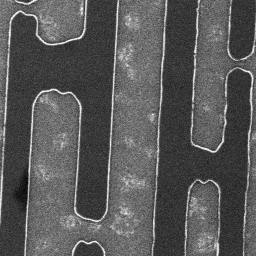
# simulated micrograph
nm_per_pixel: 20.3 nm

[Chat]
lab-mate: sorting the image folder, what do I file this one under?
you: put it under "one or a few lines or trenches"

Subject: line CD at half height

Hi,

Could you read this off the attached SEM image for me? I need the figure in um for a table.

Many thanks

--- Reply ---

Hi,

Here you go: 0.65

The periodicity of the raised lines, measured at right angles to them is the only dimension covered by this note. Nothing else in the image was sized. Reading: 1470 nanometers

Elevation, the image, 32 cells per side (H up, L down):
LLLLLLLLLLLHHHHLLLLLLHHHHLLLLHHH
LLLLLLLLLLLHHHHLLLLLLHHHHLLLLHHH
LHHHHLLLLLLHHHHLLLLLLHHHHLLLLHHH
LHHHHLLLLLLHHHHLLLLLLHHHHLLLLHHH
LHHHHLLLLLHHHHHLLLLLLHHHHLLLLHHH
LHHHHHLHHHHHHHLLLLLLLHHHLLLLLHHH
LHHHHHHHHHHHHHLLLLLLHHHHLLLLLHHL
LHHHHHHHHHHHHHLLLLLLHHHHLLLLLHLL
LHHHHHHHHHHHHHLLLLLLHHHHLLLLLLLL
LHHHHHHHHHHHHHLLLLLLHHHHLLLLHHHL
LHHHHHHHHHHHHHLLLLLLHHHHLLLLHHHL
LHHHHLLHHHHHHHLLLLLLHHHHLLLLHHHL
LHHHLLLLLLHHHHLLLLLLHHHHLLLLHHHL
LHHHLLLLLLHHHHLLLLLLHHHHLLLLHHHL
LHHHLLLLLLHHHHLLLLLLHHHHLLLLHHHL
LHHHLLLLLLHHHHLLLLLLHHHHLLLLHHHL
LHHHLLLLLLHHHHLLLLLLHHHHLLLLHHHL
LHHHLLLLLLHHHHLLLLLLHHHHLLLLHHHL
HHHHLLLLLLHHHHLLLLLLHHHHHLLHHHHL
HHHHLLLLLLHHHHLLLLLLHHHHHHHHHHHL
HHHHLLLLLLHHHHLLLLLLHHHHHHHHHHHL
HHHHLLLLLLHHHHLLLLLLHHHHHHHHHHHL
HHHHLLLLLLHHHHLLLLLLHHHHHHHHHHHL
HHHHLLLLLHHHHLLLLLLLHHHHLLLHHHHL
HHHHLLLLLHHHHLLLLLLHHHHHLLLHHHHL
HHHLLLLLLHHHHLLLLLLHHHHLLLLHHHHL
HHHLLLLLLHHHHLLLLLLHHHHLLLLHHHHL
HHHLLLLLLLLHLLLLLLLHHHHLLLLHHHHL
HHHLLLLLLLLLLLLLLLLHHHHLLLLHHHHL
HHHLLLLLLLLLLLLLLLLHHHHLLLLHHHHL
HHHLLLLLLLHHLLLLLLLHHHHLLLLHHHLL
HHHLLLLLLHHHHLLLLLLHHHHLLLLHHHLL